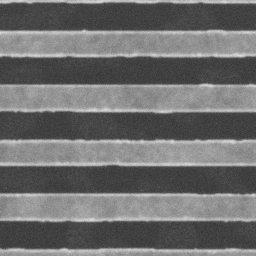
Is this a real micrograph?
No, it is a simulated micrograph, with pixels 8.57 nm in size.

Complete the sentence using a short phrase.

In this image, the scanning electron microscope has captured lines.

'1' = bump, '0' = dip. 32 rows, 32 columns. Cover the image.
00000000000000000000000000000000
00000000000000000000000000000000
00000000000000000000000000000000
00000000000000000000000000000000
11111111111111111111111111111111
11111111111111111111111111111111
11111111111111111111111111111111
00000000000000000000000000000000
00000000000000000000000000000000
00000000000000000000000000000000
00000000000000000000000000000000
11111111111111111111111111111111
11111111111111111111111111111111
11111111111111111111111111111111
00000000000000000000000000000000
00000000000000000000000000000000
00000000000000000000000000000000
00000000000000000000000000000000
11111111111111111111111111111111
11111111111111111111111111111111
11111111111111111111111111111111
00000000000000000000000000000000
00000000000000000000000000000000
00000000000000000000000000000000
11111111111111111111111111111111
11111111111111111111111111111111
11111111111111111111111111111111
11111111111111111111111111111111
00000000000000000000000000000000
00000000000000000000000000000000
00000000000000000000000000000000
11111111111111111111111111111111